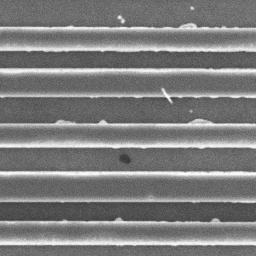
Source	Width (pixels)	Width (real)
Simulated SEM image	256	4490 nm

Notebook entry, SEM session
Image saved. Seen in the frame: lines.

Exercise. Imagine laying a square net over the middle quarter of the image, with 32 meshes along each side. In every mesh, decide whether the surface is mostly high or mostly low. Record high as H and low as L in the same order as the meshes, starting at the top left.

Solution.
LLLLLLLLLLLLLLLLLLLLLLLLLLLLLLLL
HHHHHHHHHHHHHHHHHHHHHHHLHHHHHHHH
HHHHHHHHHHHHHHHHHHHHHHHHHHHHHHHH
HHHHHHHHHHHHHHHHHHHHHHHHHHHHHHHH
HHHHHHHHHHHHHHHHHHHHHHHHHHHHHHHH
HHHHHHHHHHHHHHHHHHHHHHHHHHHHHHHH
HHHHHHHHHHHHHHHHHHHHHHHHHHHHHHHH
HHHHHHHHHHHHHHHHHHHHHHHHHHHHHHHH
LLLLLLLLLLLLLLLLLLLLLLLLLLLLLLLL
LLLLLLLLLLLLLLLLLLLLLLLLLLLLLLLL
LLLLLLLLLLLLLLLLLLLLLLLLLLLLLLLL
LLLLLLLLLLLLLLLLLLLLLLLLLLLLLLLL
LLLLLLLLLLLLLLLLLLLLLLLLLLLLLLLL
LLLLLLLLLLLLLLLLLLLLLLLLLLLLLLLL
LLLLLLLLLLLLLLLLLLLLLLLLLLLLLLLL
HHHHHHHHHHHHHHHHHHHHHHHHHHHHHHHH
HHHHHHHHHHHHHHHHHHHHHHHHHHHHHHHH
HHHHHHHHHHHHHHHHHHHHHHHHHHHHHHHH
HHHHHHHHHHHHHHHHHHHHHHHHHHHHHHHH
HHHHHHHHHHHHHHHHHHHHHHHHHHHHHHHH
HHHHHHHHHHHHHHHHHHHHHHHHHHHHHHHH
LLLLLLLLLLLLLLLLLLLLLLLLLLLLLLLL
LLLLLLLLLLLLLLLLLLLLLLLLLLLLLLLL
LLLLLLLLLLLLLLLLLLLLLLLLLLLLLLLL
LLLLLLLLLLLLLLLLLLLLLLLLLLLLLLLL
LLLLLLLLLLLLLLLLLLLLLLLLLLLLLLLL
LLLLLLLLLLLLLLLLLLLLLLLLLLLLLLLL
HHHHHHHHHHHHHHHHHHHHHHHHHHHHHHLH
HHHHHHHHHHHHHHHHHHHHHHHHHHHHHHHH
HHHHHHHHHHHHHHHHHHHHHHHHHHHHHHHH
HHHHHHHHHHHHHHHHHHHHHHHHHHHHHHHH
HHHHHHHHHHHHHHHHHHHHHHHHHHHHHHHH